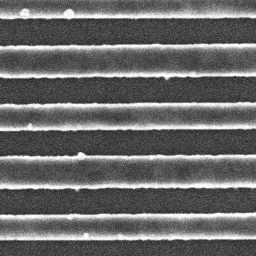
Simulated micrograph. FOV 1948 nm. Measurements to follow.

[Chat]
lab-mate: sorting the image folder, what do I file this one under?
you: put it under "lines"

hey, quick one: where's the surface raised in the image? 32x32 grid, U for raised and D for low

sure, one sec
UUUUUUUUUUUUUUUUUUUUUUUUUUUUUUUU
UUUUUUUUUUUUUUUUUUUUUUUUUUUUUUUU
DDDDDDDDDDDDDDDDDDDDDDDDDDDDDDDD
DDDDDDDDDDDDDDDDDDDDDDDDDDDDDDDD
DDDDDDDDDDDDDDDDDDDDDDDDDDDDDDDD
DDDDDDDDDDDDDDDDDDDDDDDDDDDDDDDD
UUUUUUUUUUUUUUUUUUUUUUUUUUUUUUUU
UUUUUUUUUUUUUUUUUUUUUUUUUUUUUUUU
UUUUUUUUUUUUUUUUUUUUUUUUUUUUUUUU
UUUUUUUUUUUUDUDDDDDDDDDUUDDDDDDD
DDDDDDDDDDDDDDDDDDDDDDDDDDDDDDDD
DDDDDDDDDDDDDDDDDDDDDDDDDDDDDDDD
DDDDDDDDDDDDDDDDDDDDDDDDDDDDDDDD
UUUUUUUUUUUUUUUUUUUUUUUUUUUUUUUU
UUUUUUUUUUUUUUUUUUUUUUUUUUUUUUUU
UUUUUUUUUUUUUUUUUUUUUUUUUUUUUUUU
DDDDDDDDDDDDDDDDDDDDDDDDDDDDDDDD
DDDDDDDDDDDDDDDDDDDDDDDDDDDDDDDD
DDDDDDDDDDDDDDDDDDDDDDDDDDDDDDDD
DDDDDDDDDUUDDDDDDDDUUDUDUUUUUUUU
UUUUUUUUUUUUUUUUUUUUUUUUUUUUUUUU
UUUUUUUUUUUUUUUUUUUUUUUUUUUUUUUU
UUUUUUUUUUUUUUUUUUUUUUUUUUUUUUUU
DDDDDDDUDUDUDDDDDDDDDDDDDDDDDDDD
DDDDDDDDDDDDDDDDDDDDDDDDDDDDDDDD
DDDDDDDDDDDDDDDDDDDDDDDDDDDDDDDD
DDDDDDDDDDDDDDDDDDDDDDDDDDDDDDDD
UUUUUUUUUUUUUUUUUUUUUUUUUUUUUUUU
UUUUUUUUUUUUUUUUUUUUUUUUUUUUUUUU
UUUUUUUUUUUUUUUUUUUUUUUUUUUUUUUU
DDDDDDDDDDDDDDDDDDDDDDDDDDDDDDDD
DDDDDDDDDDDDDDDDDDDDDDDDDDDDDDDD